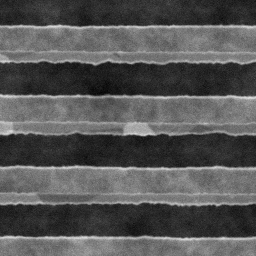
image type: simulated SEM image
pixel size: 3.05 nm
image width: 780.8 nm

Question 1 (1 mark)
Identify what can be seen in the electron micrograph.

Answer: lines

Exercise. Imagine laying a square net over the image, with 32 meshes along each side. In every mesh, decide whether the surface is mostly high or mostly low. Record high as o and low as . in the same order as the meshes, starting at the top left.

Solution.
................................
................................
................................
oooooooooooooooooooooooooooooooo
oooooooooooooooooooooooooooooooo
oooooooooooooooooooooooooooooooo
oooooooooooooooooooooooooooooooo
oooooooooooooooooooooooooooooooo
................................
................................
................................
................................
oooooooooooooooooooooooooooooooo
oooooooooooooooooooooooooooooooo
oooooooooooooooooooooooooooooooo
oooooooooooooooooooooooooooooooo
ooooooooo.ooooooooooooooooo.oooo
................................
................................
................................
................................
oooooooooooooooooooooooooooooooo
oooooooooooooooooooooooooooooooo
oooooooooooooooooooooooooooooooo
oooooooooooooooooooooooooooooooo
oo.o..o..............oooooooooo.
................................
................................
................................
................................
oooooooooooooooooooooooooooooooo
oooooooooooooooooooooooooooooooo